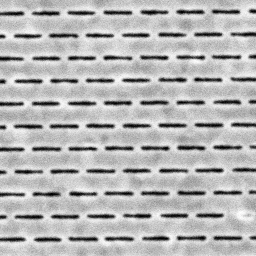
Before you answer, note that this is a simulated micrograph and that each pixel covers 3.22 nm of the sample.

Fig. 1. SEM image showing a regular array of holes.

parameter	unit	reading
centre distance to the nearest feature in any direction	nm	91.2